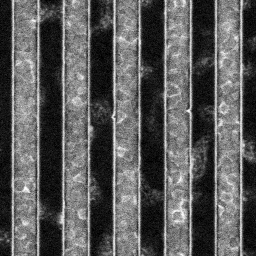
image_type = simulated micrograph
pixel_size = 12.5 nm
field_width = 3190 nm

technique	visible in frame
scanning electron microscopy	parallel lines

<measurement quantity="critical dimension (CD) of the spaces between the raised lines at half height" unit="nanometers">304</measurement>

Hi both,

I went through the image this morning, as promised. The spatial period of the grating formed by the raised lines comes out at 631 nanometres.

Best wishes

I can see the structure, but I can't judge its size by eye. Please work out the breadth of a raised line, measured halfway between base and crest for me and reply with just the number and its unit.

0.335 um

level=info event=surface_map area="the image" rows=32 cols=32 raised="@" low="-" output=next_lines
@@---@@@---@@@---@@@@---@@@---@@
@@---@@@---@@@---@@@@---@@@---@@
@@---@@@---@@@---@@@@---@@@---@@
@@---@@@---@@@---@@@@---@@@---@@
@@---@@@---@@@---@@@@---@@@---@@
@@---@@@---@@@---@@@@---@@@---@@
@@---@@@---@@@---@@@@---@@@---@@
@@---@@@---@@@---@@@@---@@@---@@
@@---@@@---@@@---@@@@---@@@---@@
@@---@@@---@@@---@@@@---@@@---@@
@@---@@@---@@@---@@@@---@@@---@@
@@---@@@---@@@---@@@@---@@@---@@
@@---@@@---@@@---@@@@---@@@---@@
@@---@@@---@@@---@@@@---@@@---@@
@@---@@@---@@@---@@@@---@@@---@@
@@---@@@---@@@---@@@@---@@@---@@
@@---@@@---@@@---@@@@---@@@---@@
@@---@@@---@@@---@@@@---@@@---@@
@@---@@@---@@@---@@@@---@@@---@@
@@---@@@---@@@---@@@@---@@@---@@
@@---@@@---@@@---@@@@---@@@---@@
@@---@@@---@@@---@@@@---@@@---@@
@@---@@@---@@@---@@@@---@@@---@@
@@---@@@---@@@---@@@@---@@@---@@
@@---@@@---@@@---@@@@---@@@---@@
@@---@@@---@@@---@@@@---@@@---@@
@@---@@@---@@@---@@@@---@@@---@@
@@---@@@---@@@---@@@@---@@@---@@
@@---@@@---@@@---@@@@---@@@---@@
@@---@@@---@@@---@@@@---@@@---@@
@@---@@@---@@@---@@@@---@@@---@@
@@---@@@---@@@---@@@@---@@@---@@